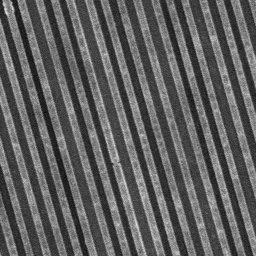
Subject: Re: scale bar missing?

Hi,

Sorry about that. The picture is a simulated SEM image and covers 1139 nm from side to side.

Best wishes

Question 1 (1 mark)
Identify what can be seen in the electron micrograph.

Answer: parallel lines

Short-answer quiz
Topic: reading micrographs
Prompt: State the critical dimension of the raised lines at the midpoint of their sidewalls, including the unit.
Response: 0.031 micrometres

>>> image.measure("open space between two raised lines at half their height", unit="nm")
35.3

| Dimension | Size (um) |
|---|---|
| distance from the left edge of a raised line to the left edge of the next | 0.0696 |